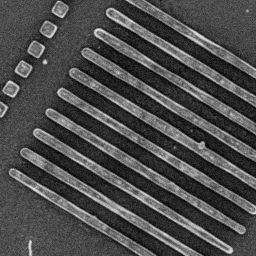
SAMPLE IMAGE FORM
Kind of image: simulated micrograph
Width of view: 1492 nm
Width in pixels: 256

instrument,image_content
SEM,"groups of lines, slits or small figures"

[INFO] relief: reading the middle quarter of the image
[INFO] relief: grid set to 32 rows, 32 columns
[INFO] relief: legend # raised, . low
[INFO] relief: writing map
.........####........###.......#
..##.......####.......####......
..###.......####........###.....
...####.......####.......####...
....####........###........####.
......####........###........###
#.......####.......###.........#
##.......####........###........
###........####.......####......
.####........####.......###.....
...####.......####.......####...
.....###........####.......####.
......####.......#####......####
#.......####.......#####......##
##........###.......#####.......
####.......####.......#####.....
..###........####.......####....
...####........###.......#####..
.....####.......####.......####.
.......###........###........###
#.......####........###........#
##........####.......####.......
####.......####........###......
..###........####.......####....
....###.......#####.......####..
.....####.......####........###.
.......####.......####.......###
#.......####.......####........#
###.......####.......####.......
####.......#####......#####.....
..####.......####.......####....
....###........####.......####..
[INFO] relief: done